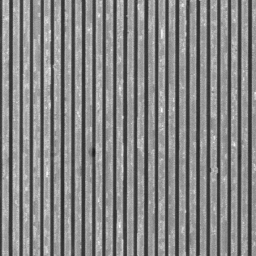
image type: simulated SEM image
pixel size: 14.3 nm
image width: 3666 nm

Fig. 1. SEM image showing parallel lines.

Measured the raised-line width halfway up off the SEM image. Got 85.9 nm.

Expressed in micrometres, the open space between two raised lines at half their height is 0.0698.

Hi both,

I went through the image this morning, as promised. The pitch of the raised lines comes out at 0.149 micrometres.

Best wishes